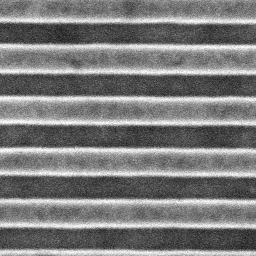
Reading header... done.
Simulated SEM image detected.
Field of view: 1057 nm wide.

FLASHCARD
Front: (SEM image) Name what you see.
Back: wiring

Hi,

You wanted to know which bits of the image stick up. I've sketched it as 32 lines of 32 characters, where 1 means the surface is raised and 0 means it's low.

11111111111111111111111111111111
11111111111111111111111111111111
11111111111111111111111111111111
00000000000000000000000000000000
00000000000000000000000000000000
00000000000000000000000000000000
11111111111111111111111111111111
11111111111111111111111111111111
11111111111111111111111111111111
00000000000000000000000000000000
00000000000000000000000000000000
00000000000000000000000000000000
11111111111111111111111111111111
11111111111111111111111111111111
11111111111111111111111111111111
00000000000011100111111111111111
00000000000000000000000000000000
00000000000000000000000000000000
00000000000000000000000000000000
11111111111111111111111111111111
11111111111111111111111111111111
11111111111111111111111111111111
00000000000000000000000000000000
00000000000000000000000000000000
00000000000000000000000000000000
11111111111111111111111111111111
11111111111111111111111111111111
11111111111111111111111111111111
00000000000000000000000000000000
00000000000000000000000000000000
00000000000000000000000000000000
11111111111111111111111111111111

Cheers